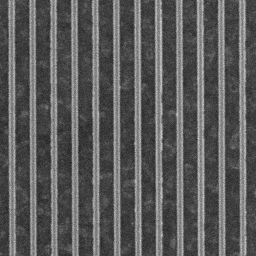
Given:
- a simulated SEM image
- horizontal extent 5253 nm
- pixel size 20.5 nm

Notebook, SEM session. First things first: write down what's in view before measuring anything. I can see parallel lines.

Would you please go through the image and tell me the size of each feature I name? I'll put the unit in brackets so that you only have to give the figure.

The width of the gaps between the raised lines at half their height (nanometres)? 339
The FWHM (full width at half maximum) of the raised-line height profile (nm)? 100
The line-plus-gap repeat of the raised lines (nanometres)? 430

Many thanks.